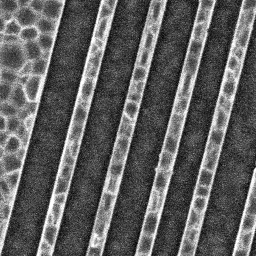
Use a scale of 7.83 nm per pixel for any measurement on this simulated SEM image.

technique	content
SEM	parallel lines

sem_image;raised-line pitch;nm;361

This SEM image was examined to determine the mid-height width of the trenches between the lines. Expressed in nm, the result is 270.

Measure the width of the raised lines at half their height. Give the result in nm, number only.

108